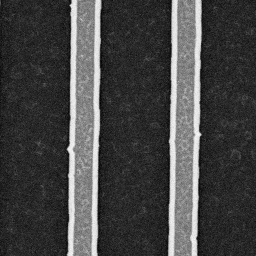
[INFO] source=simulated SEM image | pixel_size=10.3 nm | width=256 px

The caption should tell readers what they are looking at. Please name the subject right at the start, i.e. one or a few lines or trenches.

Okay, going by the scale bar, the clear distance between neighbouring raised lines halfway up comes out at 798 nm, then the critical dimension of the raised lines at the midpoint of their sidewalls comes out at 235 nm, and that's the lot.